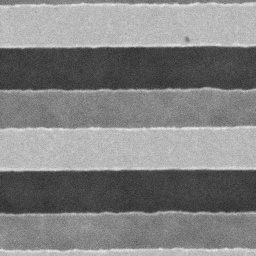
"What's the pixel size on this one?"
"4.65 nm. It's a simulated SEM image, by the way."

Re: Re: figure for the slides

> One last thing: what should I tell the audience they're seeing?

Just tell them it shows lines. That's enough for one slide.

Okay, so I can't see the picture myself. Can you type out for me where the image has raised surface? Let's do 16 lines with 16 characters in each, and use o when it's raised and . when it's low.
oooooooooooooooo
oooooooooooooooo
oooooooooooooooo
................
................
................
oooooooooooooooo
oooooooooooooooo
oooooooooooooooo
oooooooooooooooo
oooooooooooooooo
................
................
oooooooooooooooo
oooooooooooooooo
oooooooooooooooo